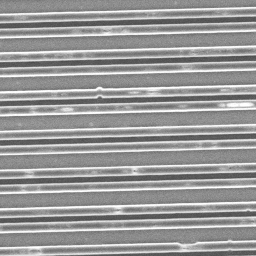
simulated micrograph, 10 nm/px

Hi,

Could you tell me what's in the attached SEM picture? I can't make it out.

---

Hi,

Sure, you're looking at parallel lines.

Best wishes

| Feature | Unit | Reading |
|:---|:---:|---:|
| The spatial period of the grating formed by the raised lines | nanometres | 195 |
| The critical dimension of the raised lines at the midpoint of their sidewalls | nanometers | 86.5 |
